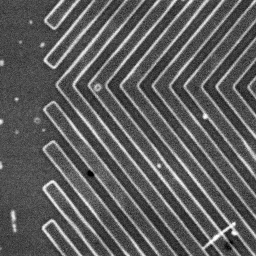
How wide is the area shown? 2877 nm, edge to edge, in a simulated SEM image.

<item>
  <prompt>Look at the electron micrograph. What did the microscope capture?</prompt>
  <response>groups of lines, slits or small figures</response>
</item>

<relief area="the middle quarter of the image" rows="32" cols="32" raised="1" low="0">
00111100001111000011110000111100
01111000011111000111110001111100
11110000111110001111100011111000
11110000111100001111000011110000
11100001111000011110000111100001
11100011111000111110001111100011
11100001111000011110000111100001
11110000111100011111000111110001
11111000111110001111100011111000
01111100011111000111110001111000
00111100001111000011110000111100
00011110000111100001111000111110
00001111000011110000111100011111
10001111100011111000111110001111
11000011110001111100011111000111
11000011110000111100001111000011
11100001111000011110000111100001
11110000111100001111000111110001
11111000111110001111100011111000
01111100011110000111110001111000
00111100001111000011110000111100
00011110000111100001111000011110
00001111000011110000111100001111
10001111100011111000111100001111
11000111110001111100011110000111
11000011110000111100001111000011
11100001111000011110000111100001
11110000111100011111000011110000
11111000111110001111100011110000
01111100011111000111100001111000
00111100001111000011110000111100
00011110000111100011111000011110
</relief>